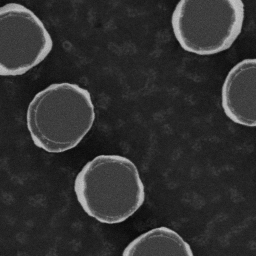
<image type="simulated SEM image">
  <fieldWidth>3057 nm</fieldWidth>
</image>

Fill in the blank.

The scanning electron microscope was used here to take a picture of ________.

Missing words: raised bodies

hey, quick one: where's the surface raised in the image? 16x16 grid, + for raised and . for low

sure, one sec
...........++++.
+++........++++.
+++........+++..
+++.............
..............++
...++.........++
..++++........++
..++++.........+
..+++...........
...+............
.....+++........
.....++++.......
.....++++.......
......++........
.........++.....
........++++....